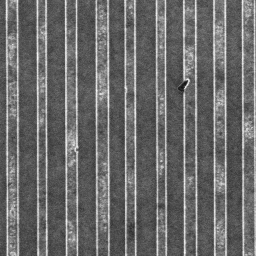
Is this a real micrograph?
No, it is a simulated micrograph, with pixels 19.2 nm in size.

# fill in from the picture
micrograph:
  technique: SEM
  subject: parallel lines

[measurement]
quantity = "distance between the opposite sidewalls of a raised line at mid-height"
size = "214 nm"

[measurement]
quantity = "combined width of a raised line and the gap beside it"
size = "29.6 pixels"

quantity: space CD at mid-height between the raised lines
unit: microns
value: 0.365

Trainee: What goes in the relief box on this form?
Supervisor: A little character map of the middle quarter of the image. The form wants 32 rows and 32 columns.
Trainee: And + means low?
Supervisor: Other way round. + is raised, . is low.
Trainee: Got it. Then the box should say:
.++.....+++.....++.....++.....++
.++.....+++.....++.....++.....++
.++.....+++.....++.....++.....++
.++.....+++.....++.....++.....++
.++.....+++.....++.....++.....++
.++.....+++.....++.....++....+++
.++.....+++.....++.....++....+++
.++.....+++.....++.....++.....++
.++.....+++.....++.....++.....++
.++.....+++.....++.....++.....++
.++.....+++.....++.....++.....++
.++.....+++.....++.....++.....++
.++.....+++.....++.....++.....++
.++.....+++.....++.....++.....++
.++.....+++.....++.....++.....++
.++.....+++.....++.....++.....++
.++.....+++.....++.....++.....++
.++.....+++.....++.....++.....++
.++.....+++.....++.....++.....++
.++.....+++.....++.....++.....++
.++.....+++.....++.....++.....++
.++.....+++.....++.....++.....++
.++.....+++.....++.....++.....++
.++.....+++.....++.....++.....++
.++.....+++.....++.....++.....++
.++.....+++.....++.....++.....++
.++.....+++.....++.....++.....++
.++.....+++.....++.....++.....++
.++.....+++.....++.....++.....++
.++.....+++.....++.....++.....++
.++.....+++.....++.....++.....++
.++.....+++.....++.....++.....++